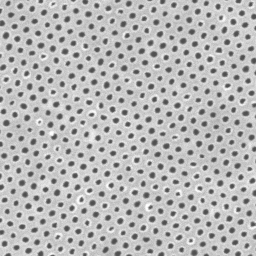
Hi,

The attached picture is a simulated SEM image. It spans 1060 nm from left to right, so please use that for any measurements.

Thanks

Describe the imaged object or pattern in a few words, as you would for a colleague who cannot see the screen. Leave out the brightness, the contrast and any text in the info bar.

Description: a regular array of holes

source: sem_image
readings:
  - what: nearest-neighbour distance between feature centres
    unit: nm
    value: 48.9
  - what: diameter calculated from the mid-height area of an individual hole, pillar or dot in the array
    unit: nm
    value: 22.4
